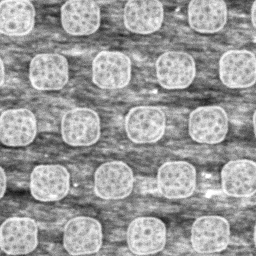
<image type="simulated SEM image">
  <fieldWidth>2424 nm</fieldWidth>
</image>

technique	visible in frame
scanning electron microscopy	a regular array of raised bodies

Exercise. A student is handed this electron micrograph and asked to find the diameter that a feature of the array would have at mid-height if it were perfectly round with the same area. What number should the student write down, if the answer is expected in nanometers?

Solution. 366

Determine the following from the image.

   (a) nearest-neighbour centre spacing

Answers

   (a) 594 nanometres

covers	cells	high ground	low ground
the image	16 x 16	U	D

UUDDUUDDUUDDUUDD
UUDDUUDDUUDDUUDD
DDDDDDDDDDDDDDDD
DDUUDDUUDDUUDDUU
DDUUDDUUDDUUDDUU
DDUUDDDDDDDDDDDD
DDDDDDDDDDDDDDDD
UUDDUUDDUUDDUUDD
UUDDUUDDUUDDUUDD
DDDDDDDDDDDDDDDD
DDUUDDUUDDUUDDUU
DDUUDDUUDDUUDDUU
DDDDDDDDDDDDDDDD
DDDDDDDDDDDDDDDD
UUDDUUDDUUDDUUDD
UUDDUUDDUUDDUUDD